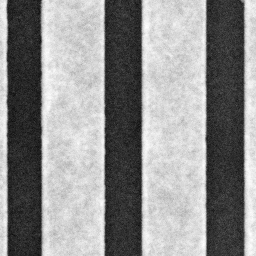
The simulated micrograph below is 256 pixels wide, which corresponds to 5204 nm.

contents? lines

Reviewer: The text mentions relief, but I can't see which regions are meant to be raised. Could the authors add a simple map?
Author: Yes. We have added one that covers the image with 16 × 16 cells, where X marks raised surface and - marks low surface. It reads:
---XXXX--XXXX--X
---XXXX--XXXX--X
---XXXX--XXXX--X
---XXXX--XXXX--X
---XXXX--XXXX--X
---XXXX--XXXX--X
---XXXX--XXXX--X
---XXXX--XXXX--X
---XXXX--XXXX--X
---XXXX--XXXX--X
---XXXX--XXXX--X
---XXXX--XXXX--X
---XXXX--XXXX--X
---XXXX--XXXX--X
---XXXX--XXXX--X
---XXXX--XXXX--X